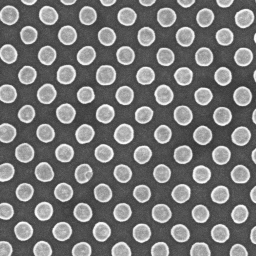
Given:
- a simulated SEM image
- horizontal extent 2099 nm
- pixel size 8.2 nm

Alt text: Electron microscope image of a regular array of raised bodies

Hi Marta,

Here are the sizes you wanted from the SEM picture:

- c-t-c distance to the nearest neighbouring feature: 224 nanometers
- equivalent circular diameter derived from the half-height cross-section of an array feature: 142 nm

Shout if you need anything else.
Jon